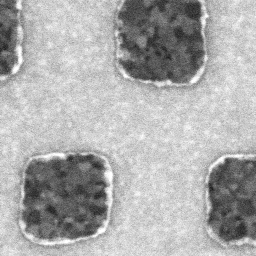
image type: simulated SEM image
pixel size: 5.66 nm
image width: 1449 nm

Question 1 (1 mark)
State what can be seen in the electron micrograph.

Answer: raised bodies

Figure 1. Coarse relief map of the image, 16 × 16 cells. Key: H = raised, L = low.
HLLLLLLHHHHHHLLL
HLLLLLLHHHHHHLLL
HLLLLLLHHHHHHLLL
HLLLLLLHHHHHHLLL
HLLLLLLLHHHHHLLL
LLLLLLLLLLLLLLLL
LLLLLLLLLLLLLLLL
LLLLLLLLLLLLLLLL
LLLLLLLLLLLLLLLL
LLLLLLLLLLLLLLLL
LLHHHHHLLLLLLHHH
LHHHHHHLLLLLLHHH
LHHHHHHLLLLLLHHH
LHHHHHHLLLLLLHHH
LLHHHHLLLLLLLHHH
LLLLLLLLLLLLLLLL